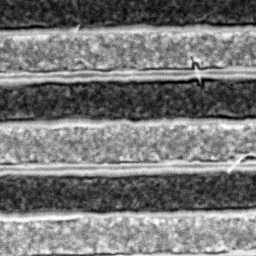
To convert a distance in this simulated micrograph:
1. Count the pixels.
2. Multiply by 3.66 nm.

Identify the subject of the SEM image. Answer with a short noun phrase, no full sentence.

lines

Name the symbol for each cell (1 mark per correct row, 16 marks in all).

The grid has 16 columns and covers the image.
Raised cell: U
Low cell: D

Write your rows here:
DDDDDDDDDDDDDDDD
DDDDDDDDDDDDDDDD
UUUUUUUUUUUUUUUU
UUUUUUUUUUUUUUUU
UUUUUUUUUUUUUUUU
DDDDDDDDDDDDDDDD
DDDDDDDDDDDDDDDD
DDDDDDDDDDDDDDDD
UUUUUUUUUUUUUUUU
UUUUUUUUUUUUUUUU
UUUUUUUUUUUUUUUU
DDDDDDDDDDDDDDDD
DDDDDDDDDDDDDDDD
DDUUUUUUUUUUUUUU
UUUUUUUUUUUUUUUU
UUUUUUUUUUUUUUUU